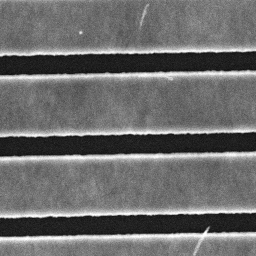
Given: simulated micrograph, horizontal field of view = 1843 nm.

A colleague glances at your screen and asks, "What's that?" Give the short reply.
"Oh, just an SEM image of lines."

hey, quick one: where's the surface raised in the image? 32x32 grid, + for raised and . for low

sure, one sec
++++++++++++++++++++++++++++++++
++++++++++++++++++++++++++++++++
++++++++++++++++++++++++++++++++
++++++++++++++++++++++++++++++++
++++++++++++++++++++++++++++++++
++++++++++++++++++++++++++++++++
+++++++++++++++++++++++.........
................................
................................
++++++++++++++++++++++++++++++++
++++++++++++++++++++++++++++++++
++++++++++++++++++++++++++++++++
++++++++++++++++++++++++++++++++
++++++++++++++++++++++++++++++++
++++++++++++++++++++++++++++++++
++++++++++++++++++++++++++++++++
++++++++++++++++++++++++++++++++
................................
................................
....++++++++++++++++++++++++++++
++++++++++++++++++++++++++++++++
++++++++++++++++++++++++++++++++
++++++++++++++++++++++++++++++++
++++++++++++++++++++++++++++++++
++++++++++++++++++++++++++++++++
++++++++++++++++++++++++++++++++
++++++++++++++++++++++++++++++++
................................
................................
..........++.+++++++++++++++++++
++++++++++++++++++++++++++++++++
++++++++++++++++++++++++++++++++